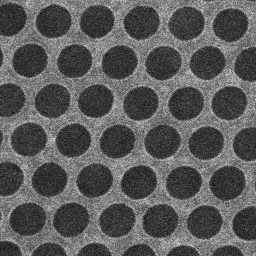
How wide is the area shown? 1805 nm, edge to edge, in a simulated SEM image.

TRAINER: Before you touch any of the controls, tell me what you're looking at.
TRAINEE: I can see a regular array of holes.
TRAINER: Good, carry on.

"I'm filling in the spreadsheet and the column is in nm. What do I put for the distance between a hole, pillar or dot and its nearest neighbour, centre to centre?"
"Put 309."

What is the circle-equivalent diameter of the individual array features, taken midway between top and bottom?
258 nm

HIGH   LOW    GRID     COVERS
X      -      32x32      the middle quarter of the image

-------XX----------X---------XX-
-------XXX--------XX---------XX-
------XXXX-------XXXX-------XXXX
X---XXXXXXX-----XXXXXX-----XXXXX
XXXXXXXXXXXXXXXXXXXXXXXXXXXXXXXX
XXXXXX-----XXXXXXXX--XXXXXXXXX--
-XXXX-------XXXX-------XXXXX----
--XX--------XXX--------XXXX-----
--XX---------XX---------XX------
--X----------XX---------XX------
--X---------XX----------XX------
-XXX--------XXX---------XX------
XXXX-------XXXX--------XXXX-----
XXXXXX---XXXXXXX------XXXXX-----
XX-XXXXXXXXXXXXXXXXXXXXXXXXXXXXX
-----XXXXXXX----XXXXXXX----XXXXX
------XXXX-------XXXX-------XXXX
-------XX---------XX---------XXX
-------XX---------XX---------XX-
-------X----------XX----------X-
-------XX---------XX---------XX-
------XXX--------XXX---------XX-
-----XXXXX------XXXXX-------XXXX
X--XXXXXXXX----XXXXXXX-----XXXXX
XXXXXXX--XXXXXXXXXXXXXXXXXXXXXXX
XXXXX------XXXXXX----XXXXXXXX---
XXXX--------XXXX-------XXXX-----
-XX---------XXX--------XXX------
-XX---------XX---------XX-------
-XX----------X----------X-------
-XX---------XX---------XX-------
XXX---------XX---------XX-------